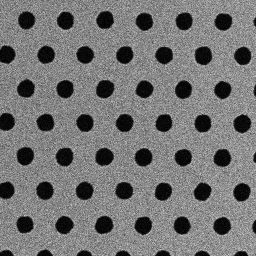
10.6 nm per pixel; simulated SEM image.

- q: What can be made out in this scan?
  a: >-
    a regular array of holes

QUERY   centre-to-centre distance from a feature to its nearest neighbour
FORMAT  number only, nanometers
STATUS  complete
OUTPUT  415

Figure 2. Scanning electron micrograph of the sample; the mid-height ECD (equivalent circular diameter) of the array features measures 188 nanometers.